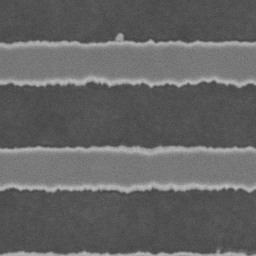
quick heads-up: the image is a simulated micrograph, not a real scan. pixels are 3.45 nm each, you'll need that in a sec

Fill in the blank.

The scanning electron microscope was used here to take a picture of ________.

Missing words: lines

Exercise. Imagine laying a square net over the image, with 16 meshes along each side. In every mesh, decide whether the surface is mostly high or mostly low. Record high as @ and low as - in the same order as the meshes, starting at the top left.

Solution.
----------------
----------------
----------------
@@@@@@@@@@@@@@@@
@@@@@@@@@@@@@@@@
----------------
----------------
----------------
----------------
@@@@@@@@@@@@@@@@
@@@@@@@@@@@@@@@@
@@@@@@@@@@@@@@@@
----------------
----------------
----------------
----------------